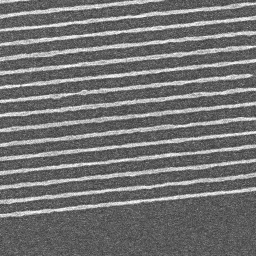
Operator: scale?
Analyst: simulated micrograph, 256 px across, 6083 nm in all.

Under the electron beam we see parallel lines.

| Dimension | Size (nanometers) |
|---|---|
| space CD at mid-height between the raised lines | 275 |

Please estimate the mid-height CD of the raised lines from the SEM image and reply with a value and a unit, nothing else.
67.9 nm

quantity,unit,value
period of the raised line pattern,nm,337